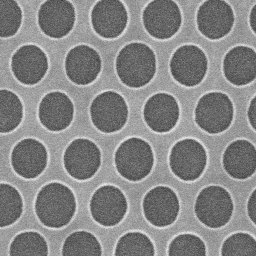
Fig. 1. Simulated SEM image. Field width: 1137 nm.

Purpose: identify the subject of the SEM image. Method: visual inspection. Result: a regular array of holes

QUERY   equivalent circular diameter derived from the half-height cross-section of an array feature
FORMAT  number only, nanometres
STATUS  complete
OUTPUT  180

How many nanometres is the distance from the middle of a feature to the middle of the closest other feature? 234